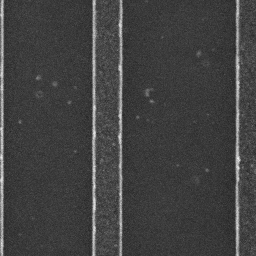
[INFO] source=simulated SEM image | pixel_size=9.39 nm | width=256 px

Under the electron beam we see one or a few lines or trenches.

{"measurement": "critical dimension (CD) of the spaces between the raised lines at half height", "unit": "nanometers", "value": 963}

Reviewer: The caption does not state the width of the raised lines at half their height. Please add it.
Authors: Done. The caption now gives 263 nanometers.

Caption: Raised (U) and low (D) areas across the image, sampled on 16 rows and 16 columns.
DDDDDDUUDDDDDDDU
DDDDDDUUDDDDDDDU
DDDDDDUUDDDDDDDU
DDDDDDUUDDDDDDDU
DDDDDDUUDDDDDDDU
DDDDDDUUDDDDDDDU
DDDDDDUUDDDDDDDU
DDDDDDUUDDDDDDDU
DDDDDDUUDDDDDDDU
DDDDDDUUDDDDDDDU
DDDDDDUUDDDDDDDU
DDDDDDUUDDDDDDDU
DDDDDDUUDDDDDDDU
DDDDDDUUDDDDDDDU
DDDDDDUUDDDDDDDU
DDDDDDUUDDDDDDDU